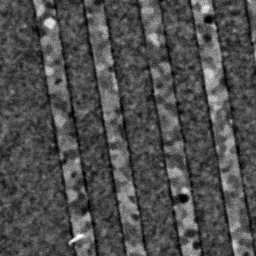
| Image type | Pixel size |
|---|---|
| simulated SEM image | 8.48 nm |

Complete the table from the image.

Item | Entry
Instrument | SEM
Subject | parallel lines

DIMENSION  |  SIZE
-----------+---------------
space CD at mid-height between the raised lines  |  269 nm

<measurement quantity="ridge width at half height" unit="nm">157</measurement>